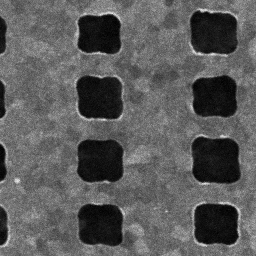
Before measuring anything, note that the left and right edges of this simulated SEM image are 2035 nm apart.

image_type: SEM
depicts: a regular array of holes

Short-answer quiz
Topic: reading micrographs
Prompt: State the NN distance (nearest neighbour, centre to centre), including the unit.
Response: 0.504 µm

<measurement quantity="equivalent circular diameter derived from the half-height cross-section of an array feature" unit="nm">378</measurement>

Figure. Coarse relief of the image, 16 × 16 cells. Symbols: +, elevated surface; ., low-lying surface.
++++++++++++++++
+++++..+++++...+
+++++...++++...+
++++++++++++++++
++++++++++++++++
+++++...++++...+
+++++...++++...+
++++++++++++++++
++++++++++++++++
+++++...++++...+
+++++...++++...+
++++++++++++++++
++++++++++++++++
+++++...++++...+
+++++...++++...+
++++++++++++++++